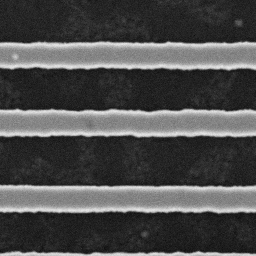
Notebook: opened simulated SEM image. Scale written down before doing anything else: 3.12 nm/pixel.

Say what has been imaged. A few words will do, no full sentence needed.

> lines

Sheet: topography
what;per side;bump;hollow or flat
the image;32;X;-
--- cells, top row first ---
--------------------------------
--------------------------------
--------------------------------
--------------------------------
--------------------------------
XXXXXXXXXXXXXXXXXXXXXXXXXXXXXXXX
XXXXXXXXXXXXXXXXXXXXXXXXXXXXXXXX
XXXXXXXXXXXXXXXXXXXXXXXXXXXXXXXX
XXXX-XXXXXXXXXXXXXXXXXXXXXXXXXXX
--------------------------------
--------------------------------
--------------------------------
--------------------------------
--------------------------------
XXXXXXXXXXXXXXXXXXXXXXXXXXXXXXXX
XXXXXXXXXXXXXXXXXXXXXXXXXXXXXXXX
XXXXXXXXXXXXXXXXXXXXXXXXXXXXXXXX
--------------------------------
--------------------------------
--------------------------------
--------------------------------
--------------------------------
--------------------------------
XXXXXXXXXXXXXXXXXXXXXXXXXXXXXXXX
XXXXXXXXXXXXXXXXXXXXXXXXXXXXXXXX
XXXXXXXXXXXXXXXXXXXXXXXXXXXXXXXX
X-X----XXXXXX--X--XXX--XX-XXXXXX
--------------------------------
--------------------------------
--------------------------------
--------------------------------
--X---------------------X-------